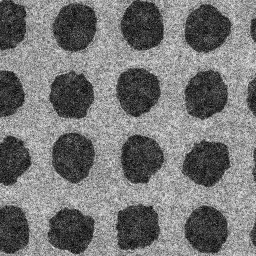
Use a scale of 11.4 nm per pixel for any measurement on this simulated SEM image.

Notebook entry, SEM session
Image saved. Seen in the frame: a regular array of raised bodies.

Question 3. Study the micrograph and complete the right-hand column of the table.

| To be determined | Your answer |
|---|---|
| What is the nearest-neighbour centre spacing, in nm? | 753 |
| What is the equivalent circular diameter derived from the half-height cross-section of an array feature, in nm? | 548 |